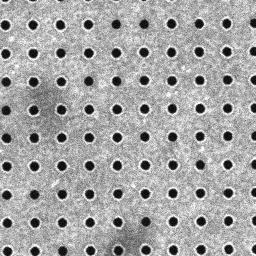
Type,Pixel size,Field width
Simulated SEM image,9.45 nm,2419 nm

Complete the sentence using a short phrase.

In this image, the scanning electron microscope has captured a regular array of holes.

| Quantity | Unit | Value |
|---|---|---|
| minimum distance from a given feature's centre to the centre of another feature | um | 0.26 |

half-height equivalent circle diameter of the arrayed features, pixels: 9.7